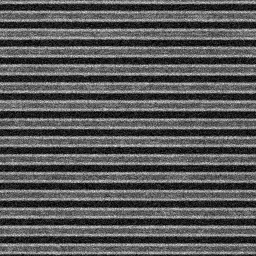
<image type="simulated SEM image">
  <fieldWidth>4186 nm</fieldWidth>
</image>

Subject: parallel lines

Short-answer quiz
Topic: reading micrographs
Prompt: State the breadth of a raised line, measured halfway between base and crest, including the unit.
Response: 131 nanometers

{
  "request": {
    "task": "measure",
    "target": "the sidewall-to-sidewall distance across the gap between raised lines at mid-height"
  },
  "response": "0.159 µm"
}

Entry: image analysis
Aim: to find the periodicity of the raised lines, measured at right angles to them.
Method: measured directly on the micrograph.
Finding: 293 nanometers